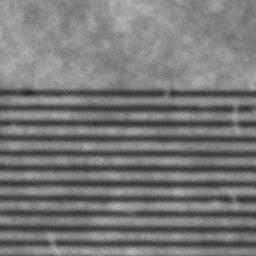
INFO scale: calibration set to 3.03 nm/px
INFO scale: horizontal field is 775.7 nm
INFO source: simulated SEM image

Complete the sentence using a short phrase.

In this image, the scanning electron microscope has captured parallel lines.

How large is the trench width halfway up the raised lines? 0.0205 um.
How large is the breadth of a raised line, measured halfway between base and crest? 0.0235 um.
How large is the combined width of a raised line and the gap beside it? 45.6 nm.